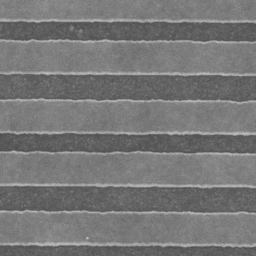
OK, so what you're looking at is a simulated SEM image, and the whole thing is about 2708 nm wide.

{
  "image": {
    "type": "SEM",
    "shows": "lines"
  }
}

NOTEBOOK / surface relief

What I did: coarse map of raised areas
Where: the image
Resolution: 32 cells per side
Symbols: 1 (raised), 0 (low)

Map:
11111111111111111111111111111111
11111111111111111111111111111111
11111111111111111111111111111111
00000000000000000000000000000000
00000000000000000000000000000000
11111111111111111111111111111111
11111111111111111111111111111111
11111111111111111111111111111111
11111111111111111111111111111111
00000000000000000000000000000000
00000000000000000000000000000000
00000000000000000000000000000000
11111111101100111001000100000000
11111111111111111111111111111111
11111111111111111111111111111111
11111111111111111111111111111111
11111111111111111111111111111111
00000000000000000000000000000000
00000000000000000000000000000000
11111111111111111111111111111111
11111111111111111111111111111111
11111111111111111111111111111111
11111111111111111111111111111111
00000000000000000000000000000000
00000000000000000000000000000000
00000000000000000000000000000000
11111101111000000000000000000000
11111111111111111111111111111111
11111111111111111111111111111111
11111111111111111111111111111111
11111111111111111111111111111111
00000000000000000000000000000000